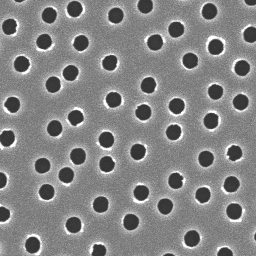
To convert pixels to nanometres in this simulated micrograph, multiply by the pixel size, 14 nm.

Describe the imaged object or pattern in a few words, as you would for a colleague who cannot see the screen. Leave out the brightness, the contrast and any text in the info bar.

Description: a regular array of holes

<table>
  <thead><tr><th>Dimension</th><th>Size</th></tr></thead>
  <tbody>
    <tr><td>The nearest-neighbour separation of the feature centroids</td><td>0.387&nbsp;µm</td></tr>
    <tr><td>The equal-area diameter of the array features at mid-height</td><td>16.2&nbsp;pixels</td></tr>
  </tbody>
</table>